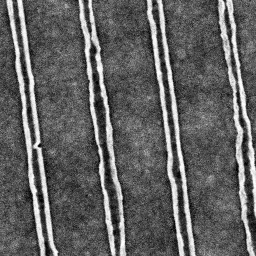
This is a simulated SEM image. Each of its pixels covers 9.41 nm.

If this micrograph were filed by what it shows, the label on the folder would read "one or a few lines or trenches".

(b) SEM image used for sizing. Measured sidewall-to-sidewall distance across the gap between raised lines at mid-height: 540 nm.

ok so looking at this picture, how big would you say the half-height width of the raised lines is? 111 nm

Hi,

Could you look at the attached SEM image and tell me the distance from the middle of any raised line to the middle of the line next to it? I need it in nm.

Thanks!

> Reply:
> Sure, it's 654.